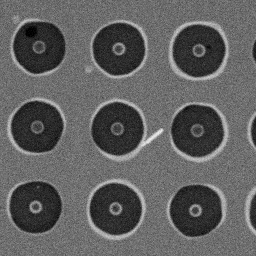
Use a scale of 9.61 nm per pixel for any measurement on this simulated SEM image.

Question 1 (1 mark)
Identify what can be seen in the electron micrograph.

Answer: an array of small figures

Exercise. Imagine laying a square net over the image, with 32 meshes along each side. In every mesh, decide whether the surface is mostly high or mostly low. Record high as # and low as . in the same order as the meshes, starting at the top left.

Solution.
################################
################################
################################
##.....######....######....#####
##......####......####......####
##..#...###.......###.......####
##......###...#...###...#...###.
##......####......###.......####
###....#####.....#####......####
##############.########....#####
################################
################################
####.###########################
##.....#####.....######....#####
##......####......####......####
#...#...###...#...###.......###.
#...#...###...#...###...#...###.
##.....#####......###.......###.
##.....#####.....#####......####
##############..#######...######
################################
################################
################################
##.....#####.....######....#####
#......####.......####......###.
#...#...###.......###.......###.
#.......###...#...###...#...###.
##.....####.......###.......###.
##.....#####.....#####.....#####
##############.########..#######
################################
################################